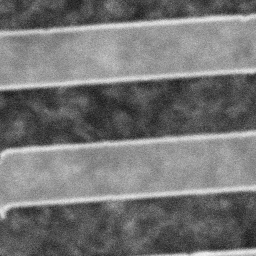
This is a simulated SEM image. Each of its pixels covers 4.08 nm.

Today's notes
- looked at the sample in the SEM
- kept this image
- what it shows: one or a few lines or trenches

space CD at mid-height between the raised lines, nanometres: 257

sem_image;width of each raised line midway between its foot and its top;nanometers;222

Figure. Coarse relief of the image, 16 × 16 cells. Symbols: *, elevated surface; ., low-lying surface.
................
.........*******
****************
****************
***************.
................
................
................
..............**
.***************
****************
****************
******..........
................
................
................